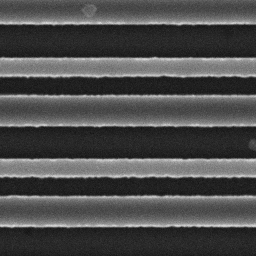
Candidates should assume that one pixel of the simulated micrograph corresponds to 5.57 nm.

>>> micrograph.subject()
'lines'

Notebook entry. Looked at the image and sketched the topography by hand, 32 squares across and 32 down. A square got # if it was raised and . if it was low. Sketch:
################################
################################
################################
................................
................................
................................
................................
################################
################################
####################.###########
................................
................................
################################
################################
################################
################################
................................
................................
................................
................................
################################
################################
................................
................................
................................
################################
################################
################################
................................
................................
................................
................................